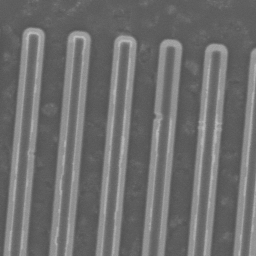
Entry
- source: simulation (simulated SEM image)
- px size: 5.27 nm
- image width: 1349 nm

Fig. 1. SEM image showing parallel lines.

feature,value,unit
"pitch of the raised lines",45.7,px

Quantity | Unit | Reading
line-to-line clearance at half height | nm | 155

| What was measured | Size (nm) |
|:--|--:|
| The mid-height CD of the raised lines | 87.8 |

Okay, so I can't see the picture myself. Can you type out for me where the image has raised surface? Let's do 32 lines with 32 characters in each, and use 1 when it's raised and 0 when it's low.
00000000000000000000000000000000
00000000000000000000000000000000
00000000000000000000000000000000
00000000000000000000000000000000
00011000010000000000000000000000
00011000011000011000010000000000
00011000011000011000110000110000
00011000011000010000110000110000
00011000011000110000110000110000
00011000010000110000110000110000
00011000110000110000110000110001
00011000110000110000110000110001
00011000110000110000110000100001
00110000110000110000110001100001
00110000110000110000110001100001
00110000110000110000110001100001
00110000110000110001100001100001
00110000110000110001100001100001
00110000110000100001100001100001
00110000110001100001100001100001
00110000110001100001100001100001
00110001100001100001100001100011
00110001100001100001100001100011
00110001100001100001100001100011
00100001100001100001100001000011
01100001100001100001100011000011
01100001100001100001100011000011
01100001100001100001100011000011
01100001100001100011000011000011
01100001100001100011000011000011
01100001100001100011000011000011
01100001100011000011000011000011